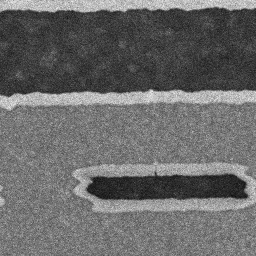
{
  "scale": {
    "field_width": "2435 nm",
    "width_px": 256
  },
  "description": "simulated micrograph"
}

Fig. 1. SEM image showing one or a few lines or trenches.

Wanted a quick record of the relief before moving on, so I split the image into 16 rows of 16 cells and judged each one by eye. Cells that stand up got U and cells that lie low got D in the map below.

DDDDDDDDDDDDDDDD
DDDDDDDDDDDDDDDD
DDDDDDDDDDDDDDDD
DDDDDDDDDDDDDDDD
DDDDDDDDDDDDDDDD
DDDDDDDDDDDDDDDD
UUUUUUUUUUUUUUUU
UUUUUUUUUUUUUUUU
UUUUUUUUUUUUUUUU
UUUUUUUUUUUUUUUU
UUUUUUUUUUUUUUUU
UUUUUDDDDDDDDDDD
UUUUUUDDDDDDDDDD
UUUUUUUUUUUUUUUU
UUUUUUUUUUUUUUUU
UUUUUUUUUUUUUUUU